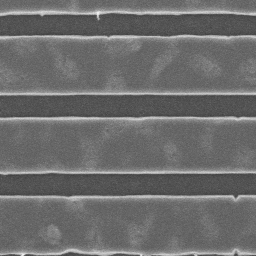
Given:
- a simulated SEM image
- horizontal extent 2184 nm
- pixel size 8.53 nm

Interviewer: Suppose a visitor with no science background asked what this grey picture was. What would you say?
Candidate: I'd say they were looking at one or a few lines or trenches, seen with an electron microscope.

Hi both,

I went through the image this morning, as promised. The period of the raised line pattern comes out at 682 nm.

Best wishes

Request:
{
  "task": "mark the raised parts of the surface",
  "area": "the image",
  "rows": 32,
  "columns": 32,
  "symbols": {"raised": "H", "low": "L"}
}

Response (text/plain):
HHHHHHHHHHHHHHHHHHHHHHHHHHHHHHHH
HHHHHHHHHHHHHHHHHHHHHHHHHHHHHHHH
LLLLLLLLLLLLLLLLLLLLLLLLLLLLLLLL
LLLLLLLLLLLLLLLLLLLLLLLLLLLLLLLL
LLHHHHLHLLLLLLLLLLLLLLHHHLLLLLLL
HHHHHHHHHHHHHHHHHHHHHHHHHHHHHHHH
HHHHHHHHHHHHHHHHHHHHHHHHHHHHHHHH
HHHHHHHHHHHHHHHHHHHHHHHHHHHHHHHH
HHHHHHHHHHHHHHHHHHHHHHHHHHHHHHHH
HHHHHHHHHHHHHHHHHHHHHHHHHHHHHHHH
HHHHHHHHHHHHHHHHHHHHHHHHHHHHHHHH
HHHHHHHHHHHHHHHHHHHHHHHHHHHHHHHH
LLLLLLLLLLLLLLLLLLLLLLLLLLLLLLLL
LLLLLLLLLLLLLLLLLLLLLLLLLLLLLLLL
LLLLLLLLLLLLLLLLLLLLLLLLLLLLLLLL
HHHHHHHHHHHHHHHHHHHHHHHHHHHHHHHH
HHHHHHHHHHHHHHHHHHHHHHHHHHHHHHHH
HHHHHHHHHHHHHHHHHHHHHHHHHHHHHHHH
HHHHHHHHHHHHHHHHHHHHHHHHHHHHHHHH
HHHHHHHHHHHHHHHHHHHHHHHHHHHHHHHH
HHHHHHHHHHHHHHHHHHHHHHHHHHHHHHHH
HHHHHHHHHHHHHHHHHHHHHLHHHHHHHHHH
LLLLLLLLLLLLLLLLLLLLLLLLLLLLLLLL
LLLLLLLLLLLLLLLLLLLLLLLLLLLLLLLL
LLLLLLLLLLLLLLLLLLLLLLLLLLLLLLLL
HHHHHHHHHHHHHHHHHHHHHHHHHHHHHHHH
HHHHHHHHHHHHHHHHHHHHHHHHHHHHHHHH
HHHHHHHHHHHHHHHHHHHHHHHHHHHHHHHH
HHHHHHHHHHHHHHHHHHHHHHHHHHHHHHHH
HHHHHHHHHHHHHHHHHHHHHHHHHHHHHHHH
HHHHHHHHHHHHHHHHHHHHHHHHHHHHHHHH
HHHHHHHHLHHHHHHHHHHHHHHHHHHHHHHH